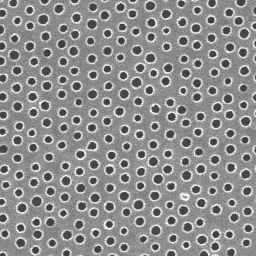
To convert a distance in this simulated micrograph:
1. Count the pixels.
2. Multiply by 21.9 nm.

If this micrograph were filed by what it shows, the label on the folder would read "a regular array of holes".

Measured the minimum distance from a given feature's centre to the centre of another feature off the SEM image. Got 0.326 micrometres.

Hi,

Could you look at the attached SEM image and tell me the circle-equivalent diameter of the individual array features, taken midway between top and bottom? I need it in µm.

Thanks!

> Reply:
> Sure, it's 0.177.